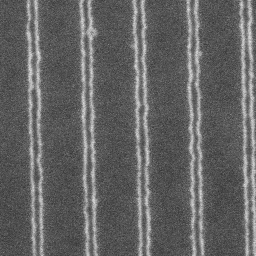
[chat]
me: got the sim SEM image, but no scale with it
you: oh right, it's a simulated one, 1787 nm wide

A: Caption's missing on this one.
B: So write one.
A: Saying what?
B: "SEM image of parallel lines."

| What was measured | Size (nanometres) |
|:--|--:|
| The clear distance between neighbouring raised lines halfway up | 311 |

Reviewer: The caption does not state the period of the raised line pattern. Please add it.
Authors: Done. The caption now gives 372 nm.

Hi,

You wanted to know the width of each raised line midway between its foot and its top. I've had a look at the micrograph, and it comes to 59.3 nm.